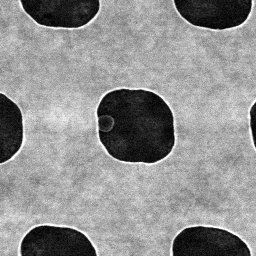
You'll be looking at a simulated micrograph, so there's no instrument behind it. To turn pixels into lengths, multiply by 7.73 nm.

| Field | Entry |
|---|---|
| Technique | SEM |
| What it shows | holes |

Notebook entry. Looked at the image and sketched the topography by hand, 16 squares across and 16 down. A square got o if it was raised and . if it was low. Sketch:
o.....ooooo.....
ooo..ooooooo...o
oooooooooooooooo
oooooooooooooooo
oooooooooooooooo
oooooooooooooooo
.ooooo....oooooo
.ooooo.....ooooo
.ooooo.....ooooo
.oooooo....ooooo
oooooooooooooooo
oooooooooooooooo
oooooooooooooooo
oooooooooooooooo
oo...oooooo...oo
o.....ooooo.....